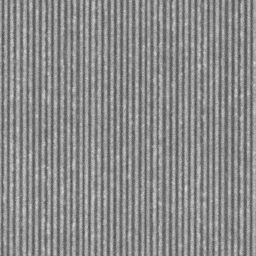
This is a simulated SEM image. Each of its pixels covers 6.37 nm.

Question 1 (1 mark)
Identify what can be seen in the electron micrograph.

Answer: parallel lines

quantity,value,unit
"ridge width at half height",18.3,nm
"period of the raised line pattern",39.7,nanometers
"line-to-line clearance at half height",21.5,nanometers